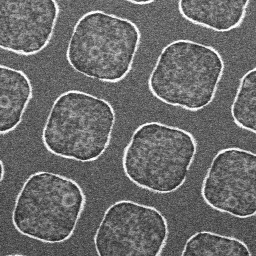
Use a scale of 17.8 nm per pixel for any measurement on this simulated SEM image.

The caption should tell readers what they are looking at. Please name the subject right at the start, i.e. holes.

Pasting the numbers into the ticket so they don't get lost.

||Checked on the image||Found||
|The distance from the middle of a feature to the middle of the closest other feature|1530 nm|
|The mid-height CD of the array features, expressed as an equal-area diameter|1210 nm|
